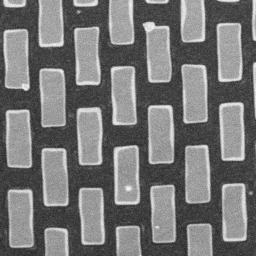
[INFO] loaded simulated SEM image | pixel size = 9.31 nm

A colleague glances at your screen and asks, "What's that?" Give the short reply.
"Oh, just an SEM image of groups of lines, slits or small figures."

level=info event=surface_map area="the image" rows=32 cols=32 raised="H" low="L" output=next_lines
LHHLLHHHLLHHLLHHLLLLLLLHHLLLLLLL
LLLLLHHHLLLLLLHHLLLLLLLHHLLLLLLL
LLLLLHHHLLLLLLHHHLLLLLLHHLLLLLLL
LLLLLHHHLLLHLLHHHLHHHLLHHLLHHHLL
LHHLLHHHLHHHLLHHHLHHHLLHHLLHHHLL
LHHLLHHHLHHHLLHHLLHHHLLLLLLHHHLL
LHHLLLLLLHHHLLLLLLHHHLLLLLLHHHLL
LHHLLLLLLLHHLLLLLLLHHLLLLLLHHHLL
LHHLLLLLLLHHLLLHHLLHHLLHHLLHHHLL
LHHHLHHHLLHHHLHHHLLHHLLHHHLHHHLL
LHHHLHHHLLHLLLHHHLLLLLLHHHLLLLLL
LLLLLHHHLLLLLLHHHLLLLLLHHHLLLLLL
LLLLLHHHLLLLLLHHHLLLLLLHHHLLLLLL
LLLLLHHHLLLLLLHHHLLHHLLHHHLLHHLL
LHHHLHHHLLHHHLHHHLLHHLLHHHLLHHLL
LHHHLHHHLLHHHLLHHLLHHHLLLLLLHHLL
LHHHLLLLLLHHHLLLLLLHHHLLLLLLHHLL
LHHHLLLLLLHHHLLLLLLHHHLLLLLLHHLL
LHHHLLLLLLHHHLLHHLLHHHLHHHLLHHLL
LHHHLHHHLLHHHLHHHLLHHHLHHHLLHHLL
LHHHLHHHLLHHLLHHHLLLLLLHHHLLLLLL
LLLLLHHHLLLLLLHHHLLLLLLHHHLLLLLL
LLLLLHHHLLLLLLHHHLLLLLLHHHLLLLLL
LLLLLLHHHLLLLLHHHLLHHHLHHHLLHHLL
LHHHLLHHHLHHHLHHHLLHHHLHHHLLHHLL
LHHHLLHHLLHHHLLLLLLHHHLLLLLLHHLL
LHHHLLLLLLHHHLLLLLLHHHLLLLLLHHHL
LHHHLLLLLLHHHLLLLLLHHHLLLLLLHHHL
LHHHLLLLLLHHHLLHHLLHHHLHHHLLHHHL
LHHHLLHHLLHHHLLHHLLHHHLLHHLLHHHL
LHHHLLHHLLLLLLLHHHLLLLLLHHLLLLLL
LLLLLLHHLLLLLLLHHHLLLLLLHHLLLLLL